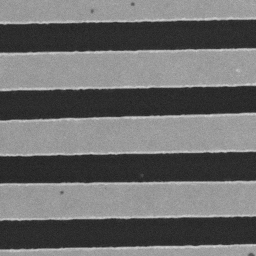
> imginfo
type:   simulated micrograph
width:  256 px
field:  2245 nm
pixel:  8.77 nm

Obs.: lines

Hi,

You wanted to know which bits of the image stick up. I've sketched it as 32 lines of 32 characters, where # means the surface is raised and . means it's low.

################################
################################
#############################...
................................
................................
................................
.........#######################
################################
################################
################################
################################
................................
................................
................................
..................##############
################################
################################
################################
################################
................................
................................
................................
................................
################################
################################
################################
################################
####............................
................................
................................
................................
################################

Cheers